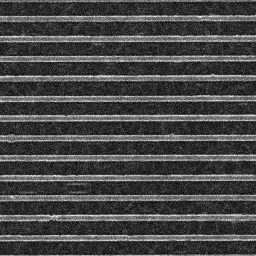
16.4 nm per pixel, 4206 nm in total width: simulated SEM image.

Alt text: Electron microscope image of parallel lines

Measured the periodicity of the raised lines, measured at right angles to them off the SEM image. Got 0.327 microns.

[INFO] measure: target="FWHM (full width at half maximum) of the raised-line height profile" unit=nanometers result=78.1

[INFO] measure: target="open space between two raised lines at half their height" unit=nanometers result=246